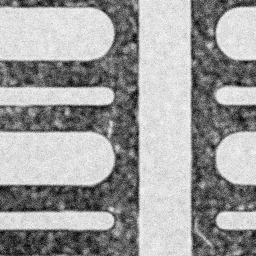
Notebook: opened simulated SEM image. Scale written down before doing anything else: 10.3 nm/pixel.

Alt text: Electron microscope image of groups of lines, slits or small figures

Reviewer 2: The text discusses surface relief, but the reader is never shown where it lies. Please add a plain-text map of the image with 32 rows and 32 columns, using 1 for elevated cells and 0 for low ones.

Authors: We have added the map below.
00000000000000000111111100000000
11111111111110000111111100000111
11111111111111000111111100001111
11111111111111000111111100011111
11111111111111000111111100011111
11111111111111000011111100011111
11111111111110000011111100001111
00000000000000000111111100000000
00000000000000000111111100000000
00000000000000000111111100000000
00000000000000000111111100000000
11111111111111000111111100011111
11111111111111000111111100011111
00000000000000000111111100000000
00000000000000000111111100000000
00000000000000000011111100000000
00000000000000000011111100000000
11111111111110000011111100001111
11111111111111000011111100011111
11111111111111000011111100011111
11111111111111000011111100011111
11111111111111000011111100001111
11111111111110000011111100000111
00000000000000000011111100000000
00000000000000000011111100000000
00000000000000000011111100000000
00000000000000000011111100000000
11111111111111000011111100011111
11111111111110000011111100001100
00000000000000000011111100000000
00000000000000000011111100000000
00000000000000000011111100000000